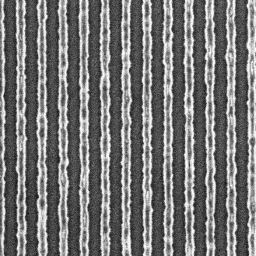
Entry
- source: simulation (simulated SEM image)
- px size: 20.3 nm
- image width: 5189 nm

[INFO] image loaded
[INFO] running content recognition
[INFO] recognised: parallel lines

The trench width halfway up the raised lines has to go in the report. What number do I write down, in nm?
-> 291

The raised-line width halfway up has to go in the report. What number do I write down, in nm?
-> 137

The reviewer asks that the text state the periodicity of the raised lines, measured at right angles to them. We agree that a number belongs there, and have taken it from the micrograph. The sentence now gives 426 nm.